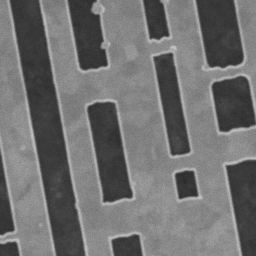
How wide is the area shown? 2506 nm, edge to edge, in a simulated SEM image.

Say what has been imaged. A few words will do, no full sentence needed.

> one or a few lines or trenches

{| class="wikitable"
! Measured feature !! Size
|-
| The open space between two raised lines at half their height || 306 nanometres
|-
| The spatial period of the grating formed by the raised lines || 607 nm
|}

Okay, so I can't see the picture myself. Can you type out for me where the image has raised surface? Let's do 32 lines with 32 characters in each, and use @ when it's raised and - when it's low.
@----@@@----@@@@@@--@@@@-----@@@
@----@@@@---@@@@@@---@@@@-----@@
@-----@@@----@@@@@---@@@@-----@@
@@----@@@----@@@@@---@@@@-----@@
@@----@@@----@@@@@---@@@@-----@@
@@----@@@----@@@@@@@@@@@@-----@@
@@----@@@----@@@@@@@@@@@@------@
@@----@@@@----@@@@@---@@@@-----@
@@-----@@@---@@@@@@---@@@@--@@@@
@@@----@@@@@@@@@@@@---@@@@@@@--@
@@@----@@@@@@@@@@@@@--@@@@-----@
@@@----@@@@@@@@@@@@@---@@@-----@
@@@----@@@@@@@@@@@@@---@@@@-----
@@@-----@@@----@@@@@---@@@@-----
@@@@----@@@----@@@@@---@@@@-----
@@@@----@@@----@@@@@---@@@@-----
@@@@----@@@----@@@@@@---@@@@-@@@
@@@@----@@@----@@@@@@---@@@@@@@@
@@@@----@@@@----@@@@@---@@@@@@@@
@@@@@----@@@----@@@@@@-@@@@@@@@@
-@@@@----@@@----@@@@@@@@@@@@----
-@@@@----@@@----@@@@@@--@@@@----
-@@@@----@@@----@@@@@@---@@@----
-@@@@----@@@@---@@@@@@---@@@@---
-@@@@----@@@@----@@@@@---@@@@---
-@@@@@----@@@@@@@@@@@@@@@@@@@---
--@@@@----@@@@@@@@@@@@@@@@@@@---
--@@@@----@@@@@@@@@@@@@@@@@@@---
--@@@@----@@@@@@@@@@@@@@@@@@@---
@@@@@@----@@@@@--@@@@@@@@@@@@@--
--@@@@@----@@@----@@@@@@@@@@@@--
---@@@@----@@@----@@@@@@@@@@@@--